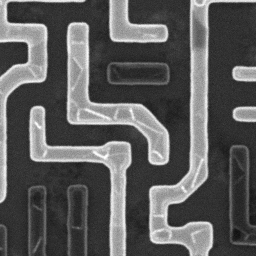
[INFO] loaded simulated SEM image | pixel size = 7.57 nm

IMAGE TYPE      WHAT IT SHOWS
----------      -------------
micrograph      wiring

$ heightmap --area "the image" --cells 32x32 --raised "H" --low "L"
HLLLLLLLLLLLLLHHLLLLLLLLHHLLLLLL
HLLLLLLLLLLLLLHHLLLLLLLLHHLLLLLL
HLLLLLLLLLLLLLHHLLLLLLLLHHLLLLLL
HHHHHHLLLHHLLLHHHHHHHLLLHHLLLLLL
HHHHHHLLHHHLLLHHHHHHHLLLHHLLLLLL
LLLHHHLLHHHLLLLLLLLLLLLLHHLLLLLL
LLLLHHLLLHHLLLLLLLLLLLLLHHLLLLLL
LLLLHHLLLHHLLLLLLLLLLLLLHHLLLLLL
LHHHHHLLLHHLLHHHHHHHHLLLHHLLLHHH
HHHHHHLLLHHLLHHHHHHHHLLLHHLLLHHH
HHHLLLLLLHHLLLLLHLLHHLLLHHLLLLLL
HLLLLLLLLHHLLLLLLLLLLLLLHHLLLLLL
HLLLLLLLLHHLLLLLLLLLLLLLHHLLLLLL
HLLLHLLLHHHHHHHHHHLLLLLLHHLLLLHH
HLLLHHLLHHHHHHHHHHHLLLLLHHLLLHHH
HLLLHHLLLLLLLLLLHHHHLLLLHHLLLLLL
HLLLHHLLLLLLLLLLLLHHHLLLHHLLLLLL
HLLLHHLLLLLLLLLLLLHHHLLLHHLLLLLL
HLLLHHHHHHHHHHHHLLLHHLLLHHLLLHHL
HLLLHHHHHHHHHHHHLLLHHLLLHHLLLHHL
HLLLLLLLLLLLLHHHLLLHLLLLHHLLLHHL
HLLLLLLLLLLLLLHHLLLLLLLLHHLLLHHL
HLLLLLLLLLLLLLHHLLLLLLLHHHLLLHHL
HLLLHLLLLHHLLLHHLLLHHHHHHLLLLHHL
HLLLHHLLHHHLLLHHLLLHHHHHLLLLLHHL
LLLLHHLLLHHLLLHHLLLHHLLLLLLLLHHL
LLLLHHLLLHHLLLHHLLLHHLLLLLLLLHHL
LLLLHHLLLHHLLLHHLLLHHLLLLLLLLHHL
HLLLHHLLHHHLLLHHLLLHHHHHHHHLLHHH
HLLLHHLLLHHLLLHHLLLHHHHHHHHLLHHH
HLLLHHLLLHHLLLHHLLLLLLLHHHHLLLHH
HLLLHHLLLHHLLLHHLLLLLLLLHHLLLLLL